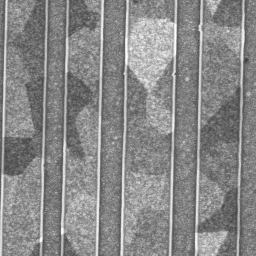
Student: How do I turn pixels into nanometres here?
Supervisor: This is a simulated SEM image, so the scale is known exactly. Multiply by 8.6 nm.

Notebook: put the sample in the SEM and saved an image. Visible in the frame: one or a few lines or trenches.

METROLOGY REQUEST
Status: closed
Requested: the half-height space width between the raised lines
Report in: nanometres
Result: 210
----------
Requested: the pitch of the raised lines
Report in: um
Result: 0.562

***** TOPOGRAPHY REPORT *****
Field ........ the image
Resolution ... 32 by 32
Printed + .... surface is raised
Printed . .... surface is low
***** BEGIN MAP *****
.+++++...++++...++++++...+++++..
.+++++...++++...++++++...+++++..
.+++++..+++++...++++++...+++++..
.+++++..+++++...++++++...+++++..
.+++++..+++++...++++++...+++++..
.+++++..+++++...++++++...+++++..
.+++++..+++++...++++++...+++++..
.+++++..+++++...++++++...+++++..
.+++++..+++++...++++++...+++++..
.+++++..+++++...++++++...+++++..
.+++++..+++++...++++++...+++++..
.+++++..++++....++++++...+++++..
.+++++..++++....++++++...+++++..
.+++++..++++....++++++...+++++..
.++++...++++....++++++...+++++..
.++++...++++....++++++...+++++..
.++++...++++....++++++...+++++..
+++++...++++....++++++...+++++..
+++++...++++....++++++...+++++..
+++++...++++...+++++++...+++++..
+++++...++++...+++++++...+++++..
+++++...++++...++++++....+++++..
+++++...++++...++++++....+++++..
+++++...++++...++++++....+++++..
+++++...++++...++++++....+++++..
+++++...++++...++++++....+++++..
+++++...++++...++++++....+++++..
+++++...++++...++++++....+++++..
+++++...++++...++++++....+++++..
+++++...++++...++++++....+++++..
+++++...++++...++++++....+++++..
+++++...++++...++++++....+++++..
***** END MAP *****